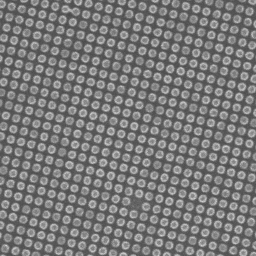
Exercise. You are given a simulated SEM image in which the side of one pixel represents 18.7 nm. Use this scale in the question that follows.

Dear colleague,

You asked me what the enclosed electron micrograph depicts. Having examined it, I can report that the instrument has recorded a regular array of raised bodies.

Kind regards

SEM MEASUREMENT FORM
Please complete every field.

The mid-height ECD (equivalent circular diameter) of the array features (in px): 7.65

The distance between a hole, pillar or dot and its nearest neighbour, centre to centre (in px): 10.4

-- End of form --